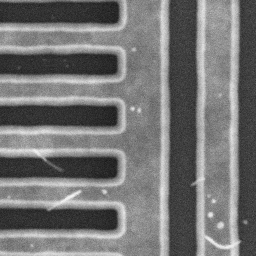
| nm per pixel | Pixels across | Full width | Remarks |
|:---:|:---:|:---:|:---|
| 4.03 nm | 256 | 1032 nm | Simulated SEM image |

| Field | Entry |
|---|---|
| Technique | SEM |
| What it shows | groups of lines, slits or small figures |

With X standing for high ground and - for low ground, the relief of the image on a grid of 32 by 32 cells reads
---------------XXXXXX----XXXX---
---------------XXXXXX----XXXX---
---------------XXXXXX----XXXX---
XXXXXXXXXXXXXXXXXXXXX----XXXX---
XXXXXXXXXXXXXXXXXXXXX----XXXX---
XXXXXXXXXXXXXXXXXXXXX----XXXX---
---------------XXXXXX----XXXX---
---------------XXXXXX----XXXX---
---------------XXXXXX----XXXX---
---------------XXXXXX----XXXX---
XXXXXXXXXXXXXXXXXXXXX----XXXX---
XXXXXXXXXXXXXXXXXXXXX----XXXX---
XXXXXXXXXXXXXXXXXXXXX----XXXX---
---------------XXXXXX----XXXX---
---------------XXXXXX----XXXX---
---------------XXXXXX----XXXX---
XXXXXXXXXXXXXXXXXXXXX----XXXX---
XXXXXXXXXXXXXXXXXXXXX----XXXX---
XXXXXXXXXXXXXXXXXXXXX----XXXX---
---------------XXXXXX----XXXX---
---------------XXXXXX----XXXX---
---------------XXXXXX----XXXX---
---------------XXXXXX----XXXX---
XXXXXXXXXXXXXXXXXXXXX----XXXX---
XXXXXXXXXXXXXXXXXXXXX----XXXX---
XXXXXXXXXXXXXXXXXXXXX----XXXX---
---------------XXXXXX----XXXX---
---------------XXXXXX----XXXX---
---------------XXXXXX----XXXX---
XXXXXXXXXXXXXXXXXXXXX----XXXX---
XXXXXXXXXXXXXXXXXXXXX----XXXXX--
XXXXXXXXXXXXXXXXXXXXX----XXXX---